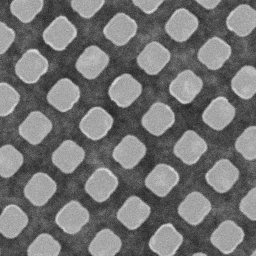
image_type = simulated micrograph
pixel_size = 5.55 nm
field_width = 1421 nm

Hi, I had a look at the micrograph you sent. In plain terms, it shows a regular array of raised bodies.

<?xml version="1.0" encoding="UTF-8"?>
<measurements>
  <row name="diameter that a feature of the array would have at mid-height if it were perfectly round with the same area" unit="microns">0.17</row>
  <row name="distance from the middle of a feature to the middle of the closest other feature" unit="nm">239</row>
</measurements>